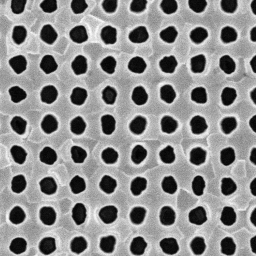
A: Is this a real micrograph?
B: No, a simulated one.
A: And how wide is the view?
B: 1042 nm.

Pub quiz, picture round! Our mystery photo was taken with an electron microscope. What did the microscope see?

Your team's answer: a regular array of holes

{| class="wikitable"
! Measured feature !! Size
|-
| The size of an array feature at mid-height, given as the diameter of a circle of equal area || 70.5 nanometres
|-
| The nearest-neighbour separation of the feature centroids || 0.119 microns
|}